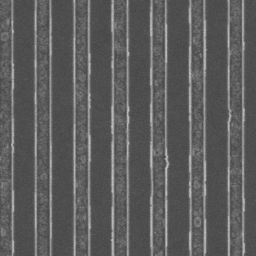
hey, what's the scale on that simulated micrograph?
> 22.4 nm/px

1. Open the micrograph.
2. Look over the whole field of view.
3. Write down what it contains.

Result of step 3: parallel lines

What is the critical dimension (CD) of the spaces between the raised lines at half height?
305 nm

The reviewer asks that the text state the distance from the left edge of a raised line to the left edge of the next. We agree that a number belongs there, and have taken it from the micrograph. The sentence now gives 0.863 microns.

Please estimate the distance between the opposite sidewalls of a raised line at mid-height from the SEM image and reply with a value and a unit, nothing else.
25.1 pixels